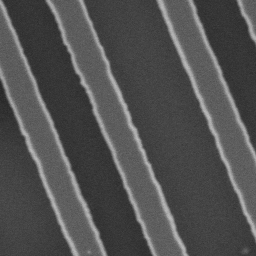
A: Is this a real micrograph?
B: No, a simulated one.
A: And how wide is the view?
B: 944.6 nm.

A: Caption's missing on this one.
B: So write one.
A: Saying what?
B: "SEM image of lines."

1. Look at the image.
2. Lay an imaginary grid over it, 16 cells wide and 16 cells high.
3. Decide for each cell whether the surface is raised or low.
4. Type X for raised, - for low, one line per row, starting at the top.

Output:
---XX-----XX---X
X---XX----XXX--X
X---XX-----XX---
XX--XXX----XX---
XX---XX-----XX--
XX---XX-----XX--
-XX---XX----XXX-
-XX---XX-----XX-
-XXX---XX----XXX
--XX---XX-----XX
--XX---XX-----XX
---XX---XX-----X
---XX---XX-----X
----XX--XXX----X
----XX---XX-----
----XXX--XXX----